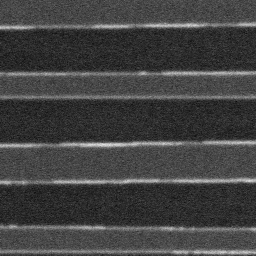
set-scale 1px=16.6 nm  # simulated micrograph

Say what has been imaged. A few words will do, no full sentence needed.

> lines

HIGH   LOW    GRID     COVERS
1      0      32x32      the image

11111111111111111111111111111111
11111111111111111111111111111111
11111111111111111111111111111111
00000000000000000000000000000000
00000000000000000000000000000000
00000000000000000000000000000000
00000000000000000000000000000000
00000000000000000000000000000000
00000000000000000000000000000000
11111111111111111111111111111111
11111111111111111111111111111111
11111111111111111111111111111111
00000000000000000000000000000000
00000000000000000000000000000000
00000000000000000000000000000000
00000000000000000000000000000000
00000000000000000000000000000000
00000000000000000000000000000000
11111111111111111111111111111111
11111111111111111111111111111111
11111111111111111111111111111111
11111111111111111111111111111111
11111111111111111111111111111111
00000000000000000000000000000000
00000000000000000000000000000000
00000000000000000000000000000000
00000000000000000000000000000000
00000000000000000000000000000000
11111111111110000000000000000000
11111111111111111111111111111111
11111111111111111111111111111111
00000000000000000000011111111111